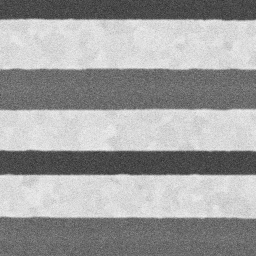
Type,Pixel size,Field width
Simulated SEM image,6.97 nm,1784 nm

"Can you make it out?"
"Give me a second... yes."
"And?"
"lines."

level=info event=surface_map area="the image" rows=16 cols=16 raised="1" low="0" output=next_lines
0000000000000000
1111111111111111
1111111111111111
1111111111111111
0000000000000000
0000000000000000
0000000000000000
1111111111111111
1111111111111111
0000000000000000
0000000000000000
1111111111111111
1111111111111111
1111111111111111
0000000000000000
0000000000000000